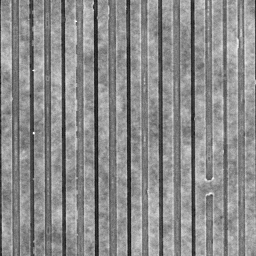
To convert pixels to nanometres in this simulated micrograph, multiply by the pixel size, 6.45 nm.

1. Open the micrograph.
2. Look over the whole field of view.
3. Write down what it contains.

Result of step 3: parallel lines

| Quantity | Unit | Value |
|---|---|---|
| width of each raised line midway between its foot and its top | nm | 67.7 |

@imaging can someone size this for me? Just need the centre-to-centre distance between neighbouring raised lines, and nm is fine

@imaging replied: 104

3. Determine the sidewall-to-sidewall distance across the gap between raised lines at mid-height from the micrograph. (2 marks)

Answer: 42.7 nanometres